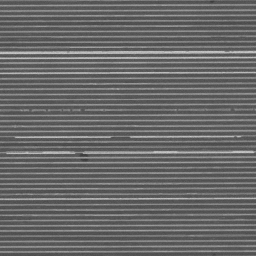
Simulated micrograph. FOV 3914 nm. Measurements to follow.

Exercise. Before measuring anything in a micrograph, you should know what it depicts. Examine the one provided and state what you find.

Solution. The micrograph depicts parallel lines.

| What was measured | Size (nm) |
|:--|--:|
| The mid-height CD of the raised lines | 24.9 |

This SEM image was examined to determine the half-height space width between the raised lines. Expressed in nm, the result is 63.1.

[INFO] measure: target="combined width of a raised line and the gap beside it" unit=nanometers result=80.2